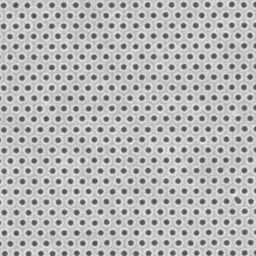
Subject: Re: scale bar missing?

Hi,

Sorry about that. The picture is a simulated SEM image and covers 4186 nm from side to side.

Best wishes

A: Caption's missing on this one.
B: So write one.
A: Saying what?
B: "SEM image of a regular array of holes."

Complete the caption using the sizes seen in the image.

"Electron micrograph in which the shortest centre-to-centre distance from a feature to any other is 11.7 px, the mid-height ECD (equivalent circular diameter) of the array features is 101 nm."